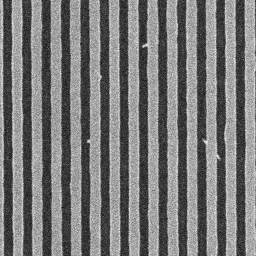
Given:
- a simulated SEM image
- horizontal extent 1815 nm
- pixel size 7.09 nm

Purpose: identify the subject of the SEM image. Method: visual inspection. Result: parallel lines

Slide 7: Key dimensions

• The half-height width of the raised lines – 69.1 nm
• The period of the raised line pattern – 137 nanometres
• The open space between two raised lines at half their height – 69.1 nm